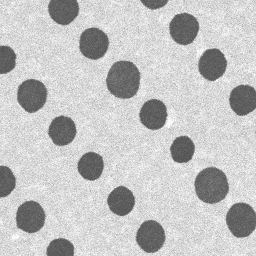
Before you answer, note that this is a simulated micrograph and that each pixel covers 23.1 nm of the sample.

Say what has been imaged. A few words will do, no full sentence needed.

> a regular array of holes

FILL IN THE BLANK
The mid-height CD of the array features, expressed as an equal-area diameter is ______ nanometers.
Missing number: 710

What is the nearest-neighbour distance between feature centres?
1060 nanometers